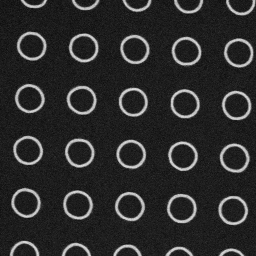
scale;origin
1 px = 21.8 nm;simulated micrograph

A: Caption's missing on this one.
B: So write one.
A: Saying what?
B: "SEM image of a regular array of raised bodies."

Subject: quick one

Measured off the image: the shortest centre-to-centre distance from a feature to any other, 1.13 µm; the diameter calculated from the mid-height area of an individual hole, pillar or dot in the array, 579 nanometers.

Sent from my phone